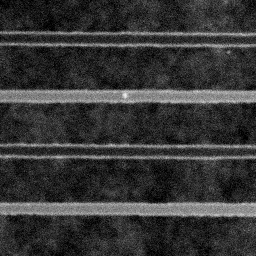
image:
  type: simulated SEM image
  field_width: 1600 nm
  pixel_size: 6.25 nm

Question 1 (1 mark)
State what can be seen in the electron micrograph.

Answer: lines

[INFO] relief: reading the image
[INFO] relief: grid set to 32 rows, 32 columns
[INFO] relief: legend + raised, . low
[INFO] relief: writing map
................................
................................
................................
................................
++++++++++++++++++++++++++++++++
++++++++++++++++++++++++++++++++
................................
................................
................................
................................
................................
++++++++++++++++++++++++++++++++
++++++++++++++++++++++++++++++++
................................
................................
................................
................................
................................
++++++++++++++++++++++++++++++++
++++++++++++++++++++++++++++++++
................................
................................
................................
................................
................................
+++++++++++++++++++..+++++++..++
++++++++++++++++++++++++++++++++
................................
................................
................................
................................
................................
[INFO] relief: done